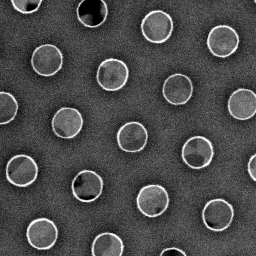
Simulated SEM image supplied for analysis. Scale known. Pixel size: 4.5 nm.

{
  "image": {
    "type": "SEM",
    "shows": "a regular array of raised bodies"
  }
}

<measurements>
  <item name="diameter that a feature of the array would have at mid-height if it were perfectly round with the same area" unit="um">0.136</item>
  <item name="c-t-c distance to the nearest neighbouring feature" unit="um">0.295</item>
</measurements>